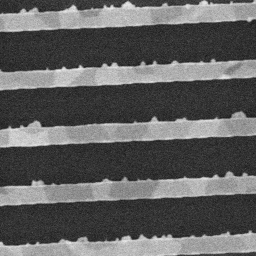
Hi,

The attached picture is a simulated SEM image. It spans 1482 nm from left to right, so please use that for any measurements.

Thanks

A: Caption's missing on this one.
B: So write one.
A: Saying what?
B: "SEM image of lines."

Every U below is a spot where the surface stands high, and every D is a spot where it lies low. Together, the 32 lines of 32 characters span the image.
DDDDDDDDDDDDDDDDDDDDDDDDDDDDDUUU
DDDDDDDUUUUUUUUUUUUUUUUUUUUUUUUU
UUUUUUUUUUUUUUUUUUUUUUUUUUUUUUDU
UUUUUUUUUUDDDDDDDDDDDDDDDDDDDDDD
DDDDDDDDDDDDDDDDDDDDDDDDDDDDDDDD
DDDDDDDDDDDDDDDDDDDDDDDDDDDDDDDD
DDDDDDDDDDDDDDDDDDDDDDDDDDDDDDDD
DDDDDDDDDDDDDDDDDDDDDDDDDDDDDDDD
DDDDDDDDDDDDDUUUUUUUUUUUUUUUUUUU
UUUUUUUUUUUUUUUUUUUUUUUUUUUUUUUU
UUUUUUUUUUUUUUUUDDDDDDDDDDDDDDDD
DDDDDDDDDDDDDDDDDDDDDDDDDDDDDDDD
DDDDDDDDDDDDDDDDDDDDDDDDDDDDDDDD
DDDDDDDDDDDDDDDDDDDDDDDDDDDDDDDD
DDDDDDDDDDDDDDDDDDDDDDDDDDDDDDDD
DDDDDDDDDDDDDDDDDUUUUUUUUUUUUUUU
UUUUUUUUUUUUUUUUUUUUUUUUUUUUUUUU
UUUUUUUUUUUUUUUUUUUUDDDDDDDDDDDD
DDDDDDDDDDDDDDDDDDDDDDDDDDDDDDDD
DDDDDDDDDDDDDDDDDDDDDDDDDDDDDDDD
DDDDDDDDDDDDDDDDDDDDDDDDDDDDDDDD
DDDDDDDDDDDDDDDDDDDDDDDDDDDDDDDD
DDDDDDDDDDDDDDDDDDUUUUUUUUUUUUUU
UUUUUUUUUUUUUUUUUUUUUUUUUUUUUUUU
UUUUUUUUUUUUUUUUUUUUUUUUUDDDDDDD
UUUDDDDDDDDDDDDDDDDDDDDDDDDDDDDD
DDDDDDDDDDDDDDDDDDDDDDDDDDDDDDDD
DDDDDDDDDDDDDDDDDDDDDDDDDDDDDDDD
DDDDDDDDDDDDDDDDDDDDDDDDDDDDDDDD
DDDDDDDDDDDDDDDDDDDDDDDDDDUUUUUU
DDDDDDUUUUUUUUUUUUUUUUUUUUUUUUUU
UUUUUUUUUUUUUUUUUUUUUUUUUUUUUDDD